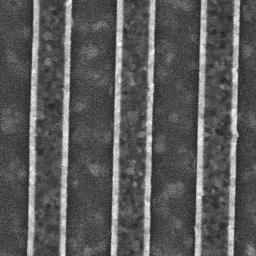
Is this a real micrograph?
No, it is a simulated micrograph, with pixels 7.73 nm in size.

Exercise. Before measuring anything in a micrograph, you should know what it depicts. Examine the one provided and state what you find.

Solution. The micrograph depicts one or a few lines or trenches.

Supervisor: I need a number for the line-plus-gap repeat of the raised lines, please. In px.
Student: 83.9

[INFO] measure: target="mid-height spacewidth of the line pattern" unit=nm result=387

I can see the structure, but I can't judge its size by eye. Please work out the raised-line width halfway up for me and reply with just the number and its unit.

261 nanometers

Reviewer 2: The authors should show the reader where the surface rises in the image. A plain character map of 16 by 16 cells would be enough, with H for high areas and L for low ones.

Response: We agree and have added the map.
LLHHLLLHHHLLLHHL
LLHHLLLHHHLLLHHL
LLHHLLLHHHLLLHHL
LLHHLLLHHLLLLHHL
LLHHLLLHHLLLLHHL
LLHHLLLHHLLLLHHL
LLHHLLLHHLLLLHHL
LLHHLLLHHLLLLHHL
LLHHLLLHHLLLHHHL
LLHHLLLHHLLLLHHL
LLHHLLLHHLLLHHHL
LLHHLLLHHLLLHHHL
LLHHLLLHHLLLHHHL
LLHHLLLHHLLLHHHL
LLHHLLLHHLLLHHLL
LLHHLLLHHLLLHHLL